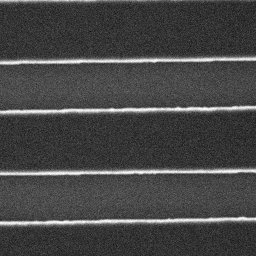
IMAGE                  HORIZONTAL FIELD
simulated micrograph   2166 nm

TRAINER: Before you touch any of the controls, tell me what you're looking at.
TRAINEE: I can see lines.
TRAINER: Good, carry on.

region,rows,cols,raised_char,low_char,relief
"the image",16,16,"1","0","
1111111111111111
1111111111111111
1111111111111111
1111111111111111
0000000000000000
0000000000000000
0000000000000000
1111111111111111
1111111111111111
1111111111111111
1111111111111111
0000000000000000
0000000000000000
0000000000000000
1111111111111111
1111111111111111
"